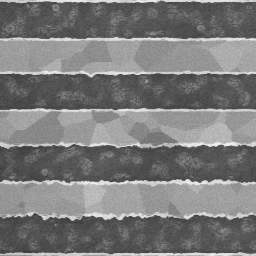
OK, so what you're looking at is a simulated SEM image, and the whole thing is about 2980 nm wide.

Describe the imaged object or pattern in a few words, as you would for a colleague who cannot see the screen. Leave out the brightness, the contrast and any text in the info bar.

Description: one or a few lines or trenches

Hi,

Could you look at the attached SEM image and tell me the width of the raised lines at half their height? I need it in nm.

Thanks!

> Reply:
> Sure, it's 402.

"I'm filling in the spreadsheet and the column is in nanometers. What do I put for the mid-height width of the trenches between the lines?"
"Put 435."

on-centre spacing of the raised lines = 832 nm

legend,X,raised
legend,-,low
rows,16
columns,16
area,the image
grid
----------------
----------------
XXX-XXXXXXX--XXX
XXXXXXXXXXXXXXXX
XXXXXXXXXXXXXXXX
----------------
----------------
XXXXXXXXXXXXXXXX
XXXXXXXXXXXXXXXX
----------------
----------------
XXXXXXXXXXXXXXXX
XXXXXXXXXXXXXXXX
X--XXXXX-XXX-XX-
----------------
----------------